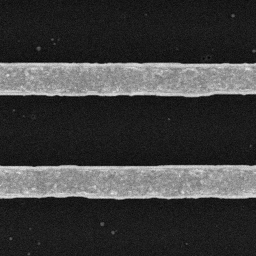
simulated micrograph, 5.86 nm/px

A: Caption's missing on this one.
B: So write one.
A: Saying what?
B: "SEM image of lines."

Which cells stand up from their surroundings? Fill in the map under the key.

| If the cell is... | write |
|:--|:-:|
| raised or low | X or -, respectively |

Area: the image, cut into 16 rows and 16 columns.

----------------
----------------
----------------
----------------
XXXXXXXXXXXXXXXX
XXXXXXXXXXXXXXXX
----------------
----------------
----------------
----------------
XXXXXXXXXXXXXXXX
XXXXXXXXXXXXXXXX
----------------
----------------
----------------
----------------